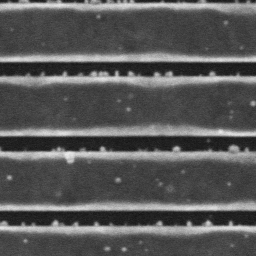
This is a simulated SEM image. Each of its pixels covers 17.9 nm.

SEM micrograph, lines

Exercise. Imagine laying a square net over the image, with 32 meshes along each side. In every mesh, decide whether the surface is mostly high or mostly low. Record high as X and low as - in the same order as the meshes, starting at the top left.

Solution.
--------------------------------
XXXXXXXXXXXXXXXXXXXXXXXXXXXXXXXX
XXXXXXXXXXXXXXXXXXXXXXXXXXXXXXXX
XXXXXXXXXXXXXXXXXXXXXXXXXXXXXXXX
XXXXXXXXXXXXXXXXXXXXXXXXXXXXXXXX
XXXXXXXXXXXXXXXXXXXXXXXXXXXXXXXX
XXXXXXXXXXXXXXXXXXXXXXXXXXXXXXXX
XXX---------------------XXXXXXXX
--------------------------------
--------------------------------
XXXXXXXXXXXXXXXXXXXXXXXXXXXXXXXX
XXXXXXXXXXXXXXXXXXXXXXXXXXXXXXXX
XXXXXXXXXXXXXXXXXXXXXXXXXXXXXXXX
XXXXXXXXXXXXXXXXXXXXXXXXXXXXXXXX
XXXXXXXXXXXXXXXXXXXXXXXXXXXXXXXX
XXXXXXXXXXXXXXXXXXXXXXXXXXXXXXXX
XXXXXXXXXXXXXXXXXX-----XXXXXXXXX
--------------------------------
--------------------------------
XXXXXXXXXXXXXXXXXXXXXXXXXXXXXX--
XXXXXXXXXXXXXXXXXXXXXXXXXXXXXXXX
XXXXXXXXXXXXXXXXXXXXXXXXXXXXXXXX
XXXXXXXXXXXXXXXXXXXXXXXXXXXXXXXX
XXXXXXXXXXXXXXXXXXXXXXXXXXXXXXXX
XXXXXXXXXXXXXXXXXXXXXXXXXXXXXXXX
XXXXXXXXXXXXXXXXXXXXXXXXXXXXXXXX
--------------------------------
--------------------------------
XX------------------------XXXXX-
XXXXXXXXXXXXXXXXXXXXXXXXXXXXXXXX
XXXXXXXXXXXXXXXXXXXXXXXXXXXXXXXX
XXXXXXXXXXXXXXXXXXXXXXXXXXXXXXXX